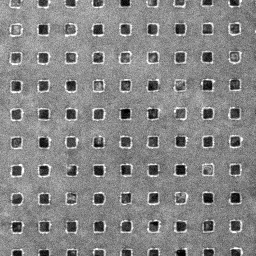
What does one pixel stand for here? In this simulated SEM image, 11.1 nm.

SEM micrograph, a regular array of raised bodies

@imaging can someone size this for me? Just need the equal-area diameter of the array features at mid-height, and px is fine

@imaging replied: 12.6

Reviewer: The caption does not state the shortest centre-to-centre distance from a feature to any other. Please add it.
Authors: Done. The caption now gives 300 nanometres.